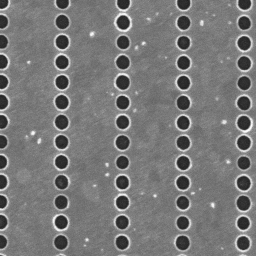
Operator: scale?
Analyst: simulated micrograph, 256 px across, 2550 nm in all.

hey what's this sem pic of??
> a regular array of holes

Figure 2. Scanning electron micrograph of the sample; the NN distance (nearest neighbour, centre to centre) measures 198 nm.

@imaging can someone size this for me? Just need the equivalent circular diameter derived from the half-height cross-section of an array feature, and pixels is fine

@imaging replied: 14.2